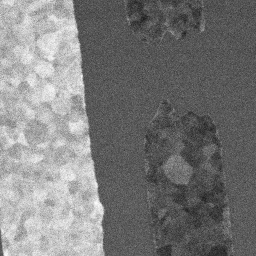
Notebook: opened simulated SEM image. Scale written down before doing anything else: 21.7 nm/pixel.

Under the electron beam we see one or a few lines or trenches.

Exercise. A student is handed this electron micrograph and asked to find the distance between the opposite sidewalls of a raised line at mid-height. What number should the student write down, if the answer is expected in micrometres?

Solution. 1.63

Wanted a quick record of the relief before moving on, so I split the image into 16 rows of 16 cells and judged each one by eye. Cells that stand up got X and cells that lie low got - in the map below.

XXXXX---XXXXX---
XXXXX---XXXXX---
XXXXX----X------
XXXXX-----------
XXXXX-----------
XXXXX-----------
XXXXX-----X-----
XXXXX-----XXX---
XXXXXX---XXXXX--
XXXXXX---XXXXX--
XXXXXX---XXXXX--
XXXXXX---XXXXX--
XXXXXX---XXXXX--
XXXXXX---XXXXX--
XXXXXX----XXXX--
XXXXXX----XXXXX-